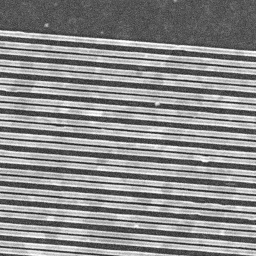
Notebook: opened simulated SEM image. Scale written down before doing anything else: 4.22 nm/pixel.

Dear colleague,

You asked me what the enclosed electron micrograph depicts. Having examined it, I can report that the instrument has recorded parallel lines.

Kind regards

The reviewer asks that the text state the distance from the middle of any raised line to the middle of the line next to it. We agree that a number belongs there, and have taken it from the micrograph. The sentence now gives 38.2 nm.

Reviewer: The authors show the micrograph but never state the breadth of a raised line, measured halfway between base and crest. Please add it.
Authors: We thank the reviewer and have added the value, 0.0179 microns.